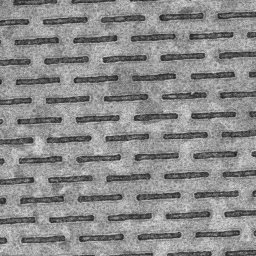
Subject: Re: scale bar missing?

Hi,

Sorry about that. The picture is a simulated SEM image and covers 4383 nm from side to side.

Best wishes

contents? a regular array of holes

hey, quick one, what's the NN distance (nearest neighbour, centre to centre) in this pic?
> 597 nm